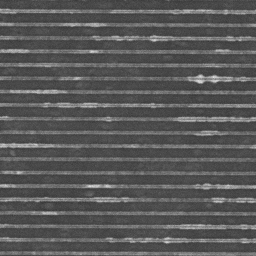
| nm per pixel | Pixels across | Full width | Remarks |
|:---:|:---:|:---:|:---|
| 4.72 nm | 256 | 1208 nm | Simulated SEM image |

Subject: parallel lines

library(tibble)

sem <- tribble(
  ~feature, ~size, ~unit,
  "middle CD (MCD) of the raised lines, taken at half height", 14.2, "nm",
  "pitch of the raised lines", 0.0634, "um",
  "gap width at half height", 0.0501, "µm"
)